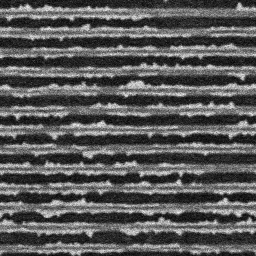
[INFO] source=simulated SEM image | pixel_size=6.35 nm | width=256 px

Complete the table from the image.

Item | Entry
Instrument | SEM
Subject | parallel lines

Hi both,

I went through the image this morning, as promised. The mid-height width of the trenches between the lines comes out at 63.5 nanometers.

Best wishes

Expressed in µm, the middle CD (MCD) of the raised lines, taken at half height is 0.0635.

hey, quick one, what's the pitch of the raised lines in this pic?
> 19.6 pixels